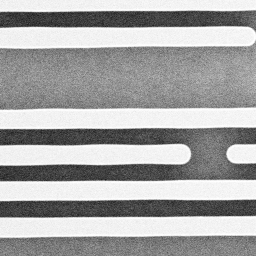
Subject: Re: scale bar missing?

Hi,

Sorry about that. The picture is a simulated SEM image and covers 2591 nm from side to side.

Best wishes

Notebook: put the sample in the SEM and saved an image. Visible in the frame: groups of lines, slits or small figures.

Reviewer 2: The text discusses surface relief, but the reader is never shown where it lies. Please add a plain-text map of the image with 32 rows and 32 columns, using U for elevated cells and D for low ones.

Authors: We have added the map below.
UUUUUUUUUUUUUUUUUUUUUUUUUUUUUUUU
DDDDDDDDDDDDDDDDDDDDDDDDDDDDDDDD
DDDDDDDDDDDDDDDDDDDDDDDDDDDDDDDD
DDUUUUUDDDDDDDDDDDDUUUUUUUUUUUUD
UUUUUUUUUUUUUUUUUUUUUUUUUUUUUUUU
UUUUUUUUUUUUUUUUUUUUUUUUUUUUUUUD
DDDDDDDDDDDDDDDDDDDDDDDDDDDDDDDD
DDDDDDDDDDDDDDDDDDDDDDDDDDDDDDDD
DDDDDDDDDDDDDDDDDDDDDDDDDDDDDDDD
DDDDDDDDDDDDDDDDDDDDDDDDDDDDDDDD
DDDDDDDDDDDDDDDDDDDDDDDDDDDDDDDD
DDDDDDDDDDDDDDDDDDDDDDDDDDDDDDDD
DDDDDDDDDDDDDDDDDDDDDDDDDDDDDDDD
DDDDDDDDDDDDDDDDDDDDDDDDDDDDDDDD
UUUUUUUUUUUUUUUUUUUUUUUUUUUUUUUU
UUUUUUUUUUUUUUUUUUUUUUUUUUUUUUUU
DDDDDDDDDDDDDDDDDDDDDDDDDDDDDDDD
DDDDDDDDDDDDDDDDDDDDDDDDDDDDDDDD
UUUUUUUUUUUUUUUUUUUUUUUDDDDDDUUU
UUUUUUUUUUUUUUUUUUUUUUUUDDDDDUUU
UUUUUDDDDDDDDDDDDDDDDDDDDDDDDDDD
DDDDDDDDDDDDDDDDDDDDDDDDDDDDDDDD
DDDDDDDDDDDDDDDDDDDDDDDDDDDDDDDD
UUUUUUUUUUUUUUUUUUUUUUUUUUUUUUUU
UUUUUUUUUUUUUUUUUUUUUUUUUUUUUUUU
DDDDDDDDDDDDDDDDDDDDDDDDDDDDDDDD
DDDDDDDDDDDDDDDDDDDDDDDDDDDDDDDD
UUUUUUUUUUUUUUUUUUUUUUUUUUUUUUUU
UUUUUUUUUUUUUUUUUUUUUUUUUUUUUUUU
UUUUUUUUUUUDDUUUUUUDDDDDDDDDDDDD
DDDDDDDDDDDDDDDDDDDDDDDDDDDDDDDD
DDDDDDDDDDDDDDDDDDDDDDDDDDDDDDDD